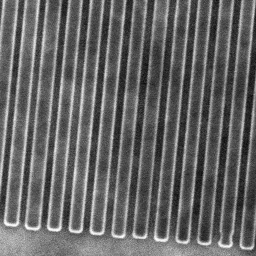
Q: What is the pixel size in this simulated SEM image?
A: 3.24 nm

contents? parallel lines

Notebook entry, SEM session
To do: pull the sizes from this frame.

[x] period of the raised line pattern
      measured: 0.0697 um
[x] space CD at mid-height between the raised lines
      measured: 0.0274 microns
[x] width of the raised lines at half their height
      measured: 43.2 nanometres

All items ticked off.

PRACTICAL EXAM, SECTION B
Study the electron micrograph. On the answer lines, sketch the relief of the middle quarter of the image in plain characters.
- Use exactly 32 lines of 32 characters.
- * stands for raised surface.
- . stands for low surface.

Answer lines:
***..***..****..***..****..***..
***..***..****..***..***...***..
***..***..****..***..***...***..
***..***..****..***..***...***..
**...***..***...***..***..****..
**...***..***...***..***..****..
**...***..***...**...***..***...
**...***..***..***...***..***...
**..****..***..***...***..***...
**..***...***..***...***..***..*
**..***...***..***..****..***..*
**..***...***..***..***...***..*
**..***...***..***..***...***..*
**..***..****..***..***...***..*
**..***..***...***..***...***..*
*...***..***...***..***..****..*
*...***..***..****..***..***...*
*...***..***..***...***..***...*
*..****..***..***...***..***...*
*..****..***..***...***..***...*
*..***...***..***..****..***..**
*..***...***..***..****..***..**
*..***...***..***..***...***..**
*..***..****..***..***...***..**
*..***..****..***..***...***..**
*..***..***...***..***..****..**
...***..***..****..***..****..**
...***..***..****..***..***...**
...***..***..***...***..***...**
..****..***..***...***..***...**
..****..***..***...***..***..***
..***...***..***..****..***..***